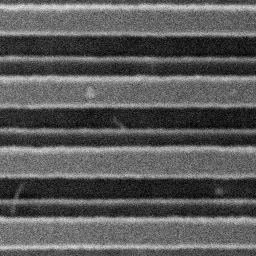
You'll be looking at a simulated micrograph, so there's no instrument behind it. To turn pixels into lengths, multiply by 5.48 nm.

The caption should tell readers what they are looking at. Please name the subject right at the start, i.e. lines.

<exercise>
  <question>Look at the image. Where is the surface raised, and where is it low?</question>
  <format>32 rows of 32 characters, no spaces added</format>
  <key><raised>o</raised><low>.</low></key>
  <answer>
................................
oooooooooooooooooooooooooooooooo
oooooooooooooooooooooooooooooooo
oooooooooooooooooooooooooooooooo
................................
................................
................................
................................
................................
......o..........o....o.o.......
oooooooooooooooooooooooooooooooo
oooooooooooooooooooooooooooooooo
oooooooooooooooooooooooooooooooo
................................
................................
................................
................................
................................
oooooooooooooooooooooooooooooooo
oooooooooooooooooooooooooooooooo
oooooooooooooooooooooooooooooooo
oooooooooooooooooooooooooooooooo
................................
................................
................................
................................
................................
oooooooooooooooooooooooooooooooo
oooooooooooooooooooooooooooooooo
oooooooooooooooooooooooooooooooo
oooooooooooooooooooooooooooooooo
................................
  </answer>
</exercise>